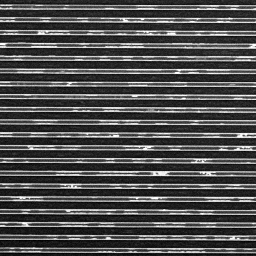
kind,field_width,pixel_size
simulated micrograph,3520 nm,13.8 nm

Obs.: parallel lines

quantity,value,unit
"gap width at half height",0.114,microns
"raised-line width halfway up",61.9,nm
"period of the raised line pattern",12.8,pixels